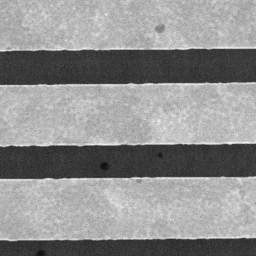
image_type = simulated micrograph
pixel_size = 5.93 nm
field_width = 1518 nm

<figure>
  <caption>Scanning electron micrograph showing lines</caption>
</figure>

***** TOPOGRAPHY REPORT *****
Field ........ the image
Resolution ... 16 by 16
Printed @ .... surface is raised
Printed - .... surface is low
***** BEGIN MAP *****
@@@@@@@@@@@@@@@@
@@@@@@@@@@@@@@@@
@@@@@@@@@@@@@@@@
----------------
----------------
@@@@@@@@@@@@@@@@
@@@@@@@@@@@@@@@@
@@@@@@@@@@@@@@@@
@@@@@@@@@@@@@@@@
----------------
----------------
@@@@@@@@@@@@@@@@
@@@@@@@@@@@@@@@@
@@@@@@@@@@@@@@@@
@@@@@@@@@@@@@@@@
----------------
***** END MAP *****